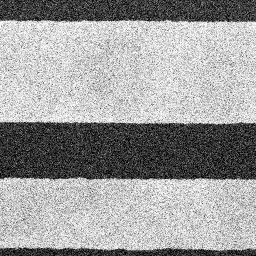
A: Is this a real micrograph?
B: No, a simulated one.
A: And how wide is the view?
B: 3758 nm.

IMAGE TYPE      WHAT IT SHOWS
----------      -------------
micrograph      one or a few lines or trenches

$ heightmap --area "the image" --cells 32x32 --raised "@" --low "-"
-------------@------------------
-----@--------------------------
-@---@--------------------------
@@@@@@@@@@@@@@@@@@@@@@@@@@@@@@@@
@@@@@@@@@@@@@@@@@@@@@@@@@@@@@@@@
@@@@@@@@@@@@@@@@@@@@@@@@@@@@@@@@
@@@@@@@@@@@@@@@@@@@@@@@@@@@@@@@@
@@@@@@@@@@@@@@@@@@@@@@@@@@@@@@@@
@@@@@@@@@@@@@@@@@@@@@@@@@@@@@@@@
@@@@@@@@@@@@@@@@@@@@@@@@@@@@@@@@
@@@@@@@@@@@@@@@@@@@@@@@@@@@@@@@@
@@@@@@@@@@@@@@@@@@@@@@@@@@@@@@@@
@@@@@@@@@@@@@@@@@@@@@@@@@@@@@@@@
@@@@@@@@@@@@@@@@@@@@@@@@@@@@@@@@
@@@@@@@@@@@@@@@@@@@@@@@@@@@@@@@@
-----------------------@--------
---------@----------------------
---------@----------------------
--------------------------------
--------------------------------
---------@----------------------
--------------------------------
@@@@@@@@@@@@@@@@@@@@@@-@@@@-@@@@
@@@@@@@@@@@@@@@@@@@@@@@@@@@@@@@@
@@@@@@@@@@@@@@@@@@@@@@@@@@@@@@@@
@@@@@@@@@@@@@@@@@@@@@@@@@@@@@@@@
@@@@@@@@@@@@@@@@@@@@@@@@@@@@@@@@
@@@@@@@@@@@@@@@@@@@@@@@@@@@@@@@@
@@@@@@@@@@@@@@@@@@@@@@@@@@@@@@@@
@@@@@@@@@@@@@@@@@@@@@@@@@@@@@@@@
@@@@@@@@@@@@@@@@@@@@@@@@@@@@@@@@
--@-----------------------------